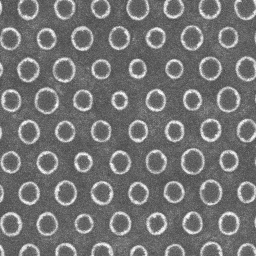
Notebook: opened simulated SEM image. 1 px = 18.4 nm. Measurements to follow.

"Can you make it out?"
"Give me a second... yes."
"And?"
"a regular array of raised bodies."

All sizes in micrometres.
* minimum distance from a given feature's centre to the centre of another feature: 0.655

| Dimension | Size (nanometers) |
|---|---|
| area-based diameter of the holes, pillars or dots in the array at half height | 386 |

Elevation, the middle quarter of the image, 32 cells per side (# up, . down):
###....####......###......####..
###....####.....####......####..
###....####......###......###...
##..............................
................................
................................
................................
...####......##......####.....##
...####.....####.....####.....##
...####.....####.....####.....##
...####......##......####.....##
......................##........
................................
................................
#........#.......###.......##...
##.....####......####.....####..
###....####......####.....####..
###....####.....#####.....####..
##.....####......###......###...
................................
................................
...............................#
....##......####.....####.....##
...####.....####.....####.....##
...####.....#####....####....###
...####.....####.....####....###
....##......####.....####.....##
................................
................................
#...............................
##.....#####.....###......####..
###....#####....#####....#####..